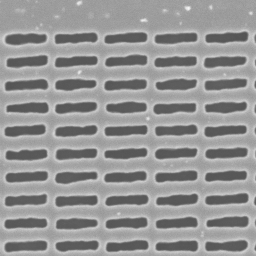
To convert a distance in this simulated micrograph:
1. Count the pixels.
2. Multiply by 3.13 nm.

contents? a regular array of holes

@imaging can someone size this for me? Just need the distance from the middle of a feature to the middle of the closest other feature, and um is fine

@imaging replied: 0.0717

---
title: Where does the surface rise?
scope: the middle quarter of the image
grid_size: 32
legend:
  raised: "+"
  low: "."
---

..+++++++++....++++++++....+....
++++++++++++++++++++++++++++++++
++++++++++++++++++++++++++++++++
++++++++++++++++++++++++++++++++
........++...........++.........
........++...........++.........
..+++++++++...+++..++++........+
++++++++++++++++++++++++++++++++
++++++++++++++++++++++++++++++++
++++++++++++++++...+++++++++++++
........+++..........++.........
........+++..........+..........
+++++++++++++++++++++++.+.++++++
++++++++++++++++++++++++++++++++
++++++++++++++++++++++++++++++++
....+...+++++........+++..++....
........++...........++.........
........++..........+++.........
++++++++++++++++++++++++++++++++
++++++++++++++++++++++++++++++++
++++++++++++++++++++++++++++++++
........++++.........++.........
........++...........++.........
.......++++.......+++++.....++++
++++++++++++++++++++++++++++++++
++++++++++++++++++++++++++++++++
++++++++++++++++++++++++++++++++
........+++.........+++.........
........++...........++.........
...++++++++......++++++..+++++++
++++++++++++++++++++++++++++++++
++++++++++++++++++++++++++++++++